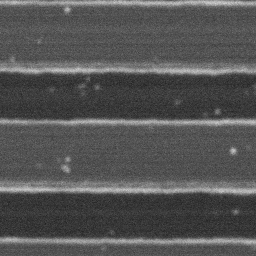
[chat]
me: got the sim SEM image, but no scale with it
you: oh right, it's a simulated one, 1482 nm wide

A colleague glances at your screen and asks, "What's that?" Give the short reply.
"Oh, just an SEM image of lines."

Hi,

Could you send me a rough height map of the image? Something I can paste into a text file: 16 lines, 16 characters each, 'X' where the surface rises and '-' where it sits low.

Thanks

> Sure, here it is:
XXXXXXXXXXXXXXXX
XXXXXXXXXXXXXXXX
XXXXXXXXXXXXXXXX
XXXXXXXXXXXXXXXX
----------------
----------------
----------------
----------------
XXXXXXXXXXXXXXXX
XXXXXXXXXXXXXXXX
XXXXXXXXXXXXXXXX
XXXXXXXXXXXXXXXX
----------------
----------------
----------------
XXXXXXXXXXXXXXXX